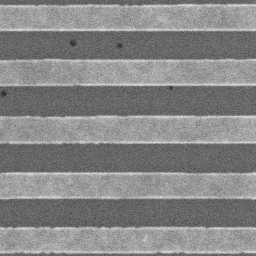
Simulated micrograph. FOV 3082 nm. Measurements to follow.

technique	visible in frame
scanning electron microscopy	lines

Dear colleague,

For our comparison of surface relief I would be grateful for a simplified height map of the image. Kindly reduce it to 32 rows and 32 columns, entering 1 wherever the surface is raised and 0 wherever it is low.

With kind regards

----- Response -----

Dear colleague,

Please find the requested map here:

00000000000000000000000000000000
11111111111111111111111111111111
11111111111111111111111111111111
11111111111111111111111111111111
00000000000000000000000000000000
00000000000000000000000000000000
00000000000000000000000000000000
00000000000000000000000000000000
11111111111111111111111111111111
11111111111111111111111111111111
11111111111111111111111111111111
00000000000000000000000000000000
00000000000000000000000000000000
00000000000000000000000000000000
00000000000000000000000000000000
11111111111111111111111111111111
11111111111111111111111111111111
11111111111111111111111111111111
00000000000000000000000000000000
00000000000000000000000000000000
00000000000000000000000000000000
00000000000000000000000000000000
11111111111111111111111111111111
11111111111111111111111111111111
11111111111111111111111111111111
00000000000000000000000000000000
00000000000000000000000000000000
00000000000000000000000000000000
00000110001100101111111110000000
11111111111111111111111111111111
11111111111111111111111111111111
11001100111111111111000111111100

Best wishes